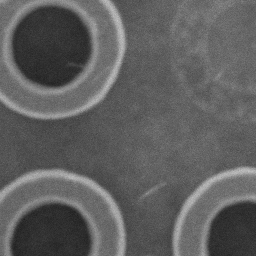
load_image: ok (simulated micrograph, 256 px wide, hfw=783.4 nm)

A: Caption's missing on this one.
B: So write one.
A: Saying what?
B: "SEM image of ring-shaped raised bodies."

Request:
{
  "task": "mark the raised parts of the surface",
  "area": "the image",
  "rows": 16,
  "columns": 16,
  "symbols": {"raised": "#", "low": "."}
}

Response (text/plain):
##..###.........
#....##.........
#.....##........
#.....##........
#....##.........
###.###.........
######..........
................
................
................
................
.#####.......###
#######.....####
#....###...##...
#.....##...##...
#.....##...##...